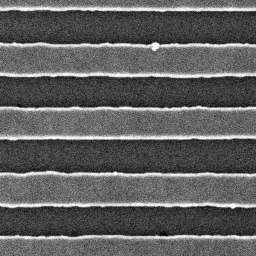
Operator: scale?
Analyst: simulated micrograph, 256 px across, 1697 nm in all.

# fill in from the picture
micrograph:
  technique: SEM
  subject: lines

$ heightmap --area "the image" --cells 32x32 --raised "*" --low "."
********************************
................................
................................
................................
................................
**..**.............*............
********************************
********************************
********************************
.****.*...*...**************....
................................
................................
................................
***.....**..**.**.....****....**
********************************
********************************
********************************
................................
................................
................................
................................
.....**.........................
********************************
********************************
********************************
********************************
................................
................................
................................
..*.......******......*****.**..
********************************
********************************